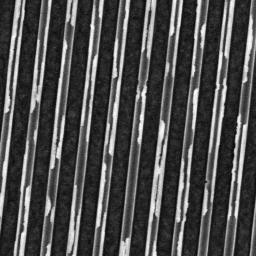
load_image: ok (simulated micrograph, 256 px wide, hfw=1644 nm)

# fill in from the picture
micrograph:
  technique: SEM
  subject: parallel lines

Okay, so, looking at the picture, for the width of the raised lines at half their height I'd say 60.6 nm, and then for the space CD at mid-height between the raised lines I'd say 0.108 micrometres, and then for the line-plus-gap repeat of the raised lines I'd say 167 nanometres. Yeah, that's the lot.